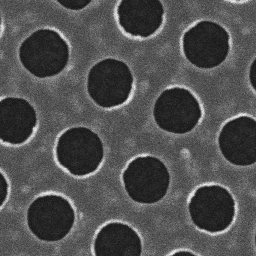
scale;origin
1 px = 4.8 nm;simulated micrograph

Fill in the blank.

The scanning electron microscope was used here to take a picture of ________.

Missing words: a regular array of holes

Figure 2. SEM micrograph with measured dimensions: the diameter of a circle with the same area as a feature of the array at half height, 226 nm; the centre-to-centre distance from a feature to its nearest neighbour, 346 nanometers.